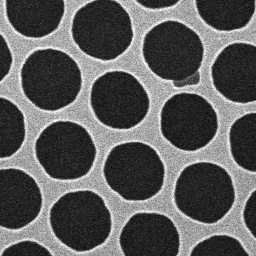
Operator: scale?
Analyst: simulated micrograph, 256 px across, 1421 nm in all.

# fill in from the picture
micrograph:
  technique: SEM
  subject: a regular array of holes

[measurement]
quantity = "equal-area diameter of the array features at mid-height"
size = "0.335 um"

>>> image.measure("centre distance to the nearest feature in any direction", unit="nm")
397